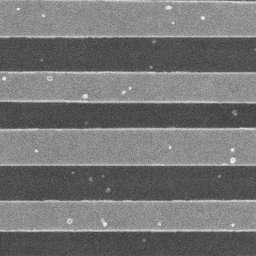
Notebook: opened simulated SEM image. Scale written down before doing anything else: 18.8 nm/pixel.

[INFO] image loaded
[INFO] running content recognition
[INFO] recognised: lines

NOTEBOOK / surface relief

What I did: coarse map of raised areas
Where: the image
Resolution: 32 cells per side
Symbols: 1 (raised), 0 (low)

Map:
11111111111111111111111111111111
11111111111111111111111111111111
11111111111111111111111111111111
11111111111111111111111111111111
11111111111111111111111111111111
00000000000000000000000000000000
00000000000000000000000000000000
00000000000000000000000000000000
00000000000000000000000000000000
11111111111111111111111111111111
11111111111111111111111111111111
11111111111111111111111111111111
11111111111111111111111111111111
00000000000000000000000000000000
00000000000000000000000000000000
00000000000000000000000000000000
11111111111111111111111111111111
11111111111111111111111111111111
11111111111111111111111111111111
11111111111111111111111111111111
11111111111111111111111111111111
00000000000000000000000000000000
00000000000000000000000000000000
00000000000000000000000000000000
00000000000000000000000000000000
11111111111111111111111111111111
11111111111111111111111111111111
11111111111111111111111111111111
11111111111111111111111111111111
00000000000000000000000000000000
00000000000000000000000000000000
00000000000000000000000000000000